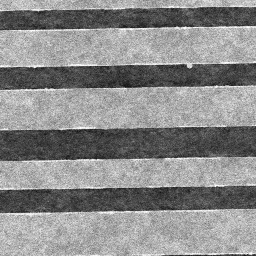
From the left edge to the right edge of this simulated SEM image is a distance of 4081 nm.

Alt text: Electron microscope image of one or a few lines or trenches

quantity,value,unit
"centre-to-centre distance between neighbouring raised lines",1000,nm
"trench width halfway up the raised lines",372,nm